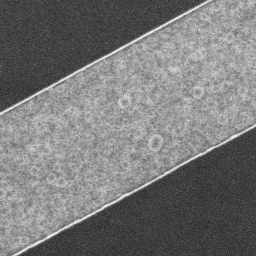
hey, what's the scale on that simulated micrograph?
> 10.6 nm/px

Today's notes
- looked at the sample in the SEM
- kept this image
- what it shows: one or a few lines or trenches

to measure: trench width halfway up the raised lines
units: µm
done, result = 1.38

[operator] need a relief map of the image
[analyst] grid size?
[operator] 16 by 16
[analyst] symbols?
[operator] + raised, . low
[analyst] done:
++++++++++++....
++++++++++......
+++++++++.......
+++++++.........
+++++...........
+++.............
+...............
................
...............+
.............+++
...........+++++
.........+++++++
.......+++++++++
......++++++++++
....++++++++++++
..++++++++++++++